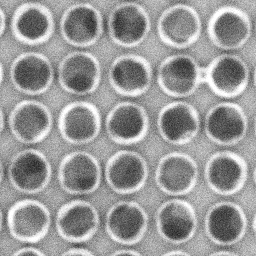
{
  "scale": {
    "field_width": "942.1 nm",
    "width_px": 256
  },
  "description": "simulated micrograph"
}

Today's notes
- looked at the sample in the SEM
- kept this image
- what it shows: a regular array of raised bodies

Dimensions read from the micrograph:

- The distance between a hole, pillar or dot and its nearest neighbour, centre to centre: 176 nm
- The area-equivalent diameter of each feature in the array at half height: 151 nm